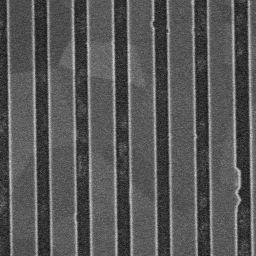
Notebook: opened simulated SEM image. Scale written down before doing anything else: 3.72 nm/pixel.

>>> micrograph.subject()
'parallel lines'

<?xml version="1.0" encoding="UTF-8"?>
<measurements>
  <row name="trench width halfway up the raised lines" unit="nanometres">53.9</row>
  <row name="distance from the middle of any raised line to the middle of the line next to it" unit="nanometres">149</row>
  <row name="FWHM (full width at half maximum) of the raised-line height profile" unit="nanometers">94.4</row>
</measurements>